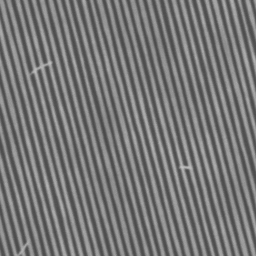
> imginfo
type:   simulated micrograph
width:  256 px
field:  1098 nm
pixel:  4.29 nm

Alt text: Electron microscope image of parallel lines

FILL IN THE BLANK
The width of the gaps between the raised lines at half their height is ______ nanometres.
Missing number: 18.7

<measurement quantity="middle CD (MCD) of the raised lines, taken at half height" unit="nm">15.1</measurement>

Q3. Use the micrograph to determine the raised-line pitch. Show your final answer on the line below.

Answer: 34.2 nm